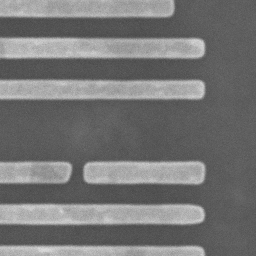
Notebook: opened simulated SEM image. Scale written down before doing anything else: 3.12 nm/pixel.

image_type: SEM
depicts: wiring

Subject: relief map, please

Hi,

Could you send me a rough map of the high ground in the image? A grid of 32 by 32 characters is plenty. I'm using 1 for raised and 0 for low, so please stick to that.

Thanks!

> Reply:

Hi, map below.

11111111111111111111110000000000
11111111111111111111110000000000
00000000000000000000000000000000
00000000000000000000000000000000
00000000000000000000000000000000
11111111111111111111111110000000
11111111111111111111111110000000
00000000000000000000000000000000
00000000000000000000000000000000
00000000000000000000000000000000
11111111111111111111111110000000
11111111111111111111111110000000
00000000000000000000000000000000
00000000000000000000000000000000
00000000000000000000000000000000
00000000000000000000000000000000
00000000000000000000000000000000
00000000000000000000000000000000
00000000000000000000000000000000
00000000000000000000000000000000
11111111100111111111111110000000
11111111100111111111111110000000
11111111000111111111111110000000
00000000000000000000000000000000
00000000000000000000000000000000
00000000000000000000000000000000
11111111111111111111111110000000
11111111111111111111111110000000
00000000000000000000000000000000
00000000000000000000000000000000
00000000000000000000000000000000
11111111111111111111111110000000